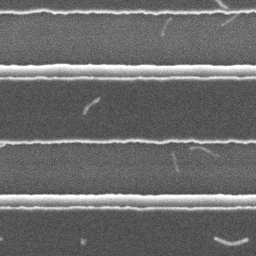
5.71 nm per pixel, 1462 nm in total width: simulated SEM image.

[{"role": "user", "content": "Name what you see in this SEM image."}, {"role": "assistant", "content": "lines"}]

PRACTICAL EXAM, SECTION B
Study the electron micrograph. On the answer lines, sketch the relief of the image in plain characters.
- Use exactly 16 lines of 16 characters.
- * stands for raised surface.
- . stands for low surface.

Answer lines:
****************
................
................
................
****************
****************
****************
****************
****************
................
................
................
****************
****************
****************
****************